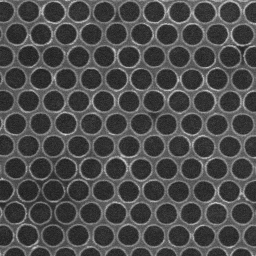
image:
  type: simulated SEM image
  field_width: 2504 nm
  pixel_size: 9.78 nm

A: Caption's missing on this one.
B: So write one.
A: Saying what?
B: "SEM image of a regular array of holes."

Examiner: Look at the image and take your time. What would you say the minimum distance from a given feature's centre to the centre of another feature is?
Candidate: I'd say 244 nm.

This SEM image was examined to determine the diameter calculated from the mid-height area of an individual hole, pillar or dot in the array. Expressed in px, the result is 20.8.